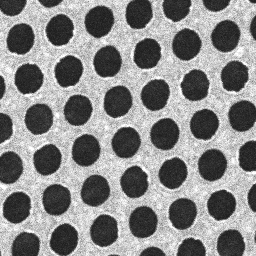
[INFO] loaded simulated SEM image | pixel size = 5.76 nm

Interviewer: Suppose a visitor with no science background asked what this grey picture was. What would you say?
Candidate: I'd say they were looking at a regular array of holes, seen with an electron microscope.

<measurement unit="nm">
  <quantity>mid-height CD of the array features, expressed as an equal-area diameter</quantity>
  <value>177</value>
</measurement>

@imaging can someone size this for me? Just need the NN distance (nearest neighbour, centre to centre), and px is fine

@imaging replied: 39.9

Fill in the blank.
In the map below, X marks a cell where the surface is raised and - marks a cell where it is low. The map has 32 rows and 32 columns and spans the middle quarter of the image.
-----XX-------XXXX-----XXXXXXXXX
-----XXX------XXXXXXXXXXXXXXXXXX
-----XXX-----XXXXXXXXXXXXXXXXX--
----XXXXXXXXXXXXXXXXXXXXXXXXXX--
----XXXXXXXXXXXXXXXXX----XXXX---
---XXXXXXXXXX--XXXXX------XXX---
XXXXXXXXXXX-----XXX--------XX---
XXXXXXXXXX-------XX-------XXXX--
X-----XXXX-------XX-------XXXX--
X------XXX-------XXX------XXXXXX
-------XXX-------XXX-----XXXXXXX
-------XXX------XXXXX---XXXXXXXX
-------XXXX-----XXXXXXXXXXXXXXXX
------XXXXXX-XXXXXXXXXXXX-XXXXXX
X-----XXXXXXXXXXXXXXXXX-----XXX-
XX--XXXXXXXXXXXXXXXXXX-------XX-
XXXXXXXXXXXXX-----XXXX-------XXX
XXXXX-XXXXXXX------XX--------XXX
XXX-----XXXX-------XXX-------XXX
XX-------XXX-------XXX------XXXX
XX-------XXX-------XXXX-----XXXX
XX-------XXX-------XXXXX--XXXXXX
XX-------XXXX-----XXXXXXXXXXXXXX
XX-------XXXXX--XXXXXXXXXXX--XXX
XXX-----XXXXXXXXXXXXXXXXX-----XX
XXXX--XXXXXXXXXXX--XXXXX-------X
XXXXXXXXXXXXXXX-----XXXX-------X
XXXXXXXXXXXXXXX------XXX-------X
XXXXXX----XXXX-------XXX-------X
XXXXX------XXX-------XXX------XX
XXXXX------XXX-------XXXX----XXX
-XXX--------XX-------XXXXXXXXXXX